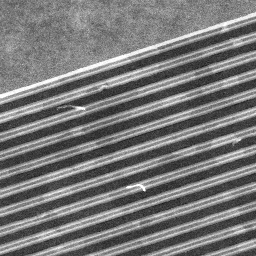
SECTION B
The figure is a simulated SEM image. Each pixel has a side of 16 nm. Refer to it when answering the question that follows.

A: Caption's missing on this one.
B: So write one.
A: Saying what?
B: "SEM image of parallel lines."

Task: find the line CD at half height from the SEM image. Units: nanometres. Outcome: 116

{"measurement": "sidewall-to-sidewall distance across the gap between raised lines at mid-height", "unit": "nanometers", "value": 173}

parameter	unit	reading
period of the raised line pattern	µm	0.286